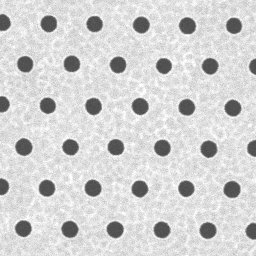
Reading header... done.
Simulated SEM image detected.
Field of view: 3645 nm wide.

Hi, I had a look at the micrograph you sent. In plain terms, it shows a regular array of holes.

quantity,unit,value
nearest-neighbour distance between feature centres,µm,0.655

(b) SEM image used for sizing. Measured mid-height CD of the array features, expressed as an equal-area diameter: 248 nm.